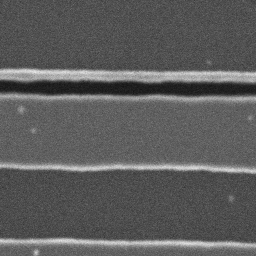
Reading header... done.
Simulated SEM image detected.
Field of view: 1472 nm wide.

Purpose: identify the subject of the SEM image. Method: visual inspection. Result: lines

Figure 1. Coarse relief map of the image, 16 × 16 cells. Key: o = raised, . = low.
................
................
................
................
oo..............
................
oooooooooooooooo
oooooooooooooooo
oooooooooooooooo
oooooooooooooooo
.oooooo....ooooo
................
................
................
................
oooooooooooooooo